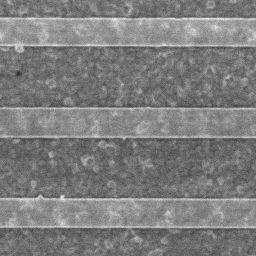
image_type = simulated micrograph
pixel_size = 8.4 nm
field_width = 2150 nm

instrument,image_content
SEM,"one or a few lines or trenches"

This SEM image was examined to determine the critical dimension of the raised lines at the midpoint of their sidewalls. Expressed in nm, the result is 239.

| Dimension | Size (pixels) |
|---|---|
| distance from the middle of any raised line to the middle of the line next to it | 90.5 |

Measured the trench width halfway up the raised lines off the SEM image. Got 516 nanometers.